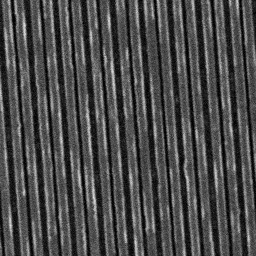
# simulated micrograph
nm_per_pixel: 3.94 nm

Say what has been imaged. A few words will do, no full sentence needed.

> parallel lines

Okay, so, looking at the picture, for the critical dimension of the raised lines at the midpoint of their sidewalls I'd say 32.9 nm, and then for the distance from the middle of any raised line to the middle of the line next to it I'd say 55.8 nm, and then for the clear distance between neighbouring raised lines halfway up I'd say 18.6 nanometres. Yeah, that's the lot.